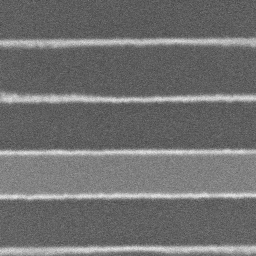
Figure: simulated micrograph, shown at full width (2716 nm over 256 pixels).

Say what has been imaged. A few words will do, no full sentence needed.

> lines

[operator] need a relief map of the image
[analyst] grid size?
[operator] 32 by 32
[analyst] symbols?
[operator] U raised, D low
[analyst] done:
DDDDDDDDDDDDDDDDDDDDDDDDDDDDDDDD
DDDDDDDDDDDDDDDDDDDDDDDDDDDDDDDD
DDDDDDDDDDDDDDDDDDDDDDDDDDDDDDDD
DDDDDDDDDDDDDDDDDDDDDDDDDDDDDDDD
DDDDDDDDDDDDDDDDDDDDDDDDDDDDDDDD
UUUUUUUUUUUUUUUUUUUUUUUUUUUUUUUU
UUUUUUUUUUUUUUUUUUUUUUUUUUUUUUUU
UUUUUUUUUUUUUUUUUUUUUUUUUUUUUUUU
UUUUUUUUUUUUUUUUUUUUUUUUUUUUUUUU
UUUUUUUUUUUUUUUUUUUUUUUUUUUUUUUU
UUUUUUUUUUUUUUUUUUUUUUUUUUUUUUUU
UUUUUUUUUUUUUUUUUUUUUUUUUUUUUUUU
DDDDDDDDDDDDDDUUUUUDDDDDDDDDDDDD
DDDDDDDDDDDDDDDDDDDDDDDDDDDDDDDD
DDDDDDDDDDDDDDDDDDDDDDDDDDDDDDDD
DDDDDDDDDDDDDDDDDDDDDDDDDDDDDDDD
DDDDDDDDDDDDDDDDDDDDDDDDDDDDDDDD
DDDDDDDDDDDDDDDDDDDDDDDDDDDDDDDD
DDDDDDDDDDDDDDDDDDDDDDDDDDDDDDDD
UUUUUUUUUUUUUUUUUUUUUUUUUUUUUUUU
UUUUUUUUUUUUUUUUUUUUUUUUUUUUUUUU
UUUUUUUUUUUUUUUUUUUUUUUUUUUUUUUU
UUUUUUUUUUUUUUUUUUUUUUUUUUUUUUUU
UUUUUUUUUUUUUUUUUUUUUUUUUUUUUUUU
UUUUUUUUUUUUUUUUUUUUUUUUUUUUUUUU
DDDDDDDDDDDDDDDDDDDDDDDDDDDDDDDD
DDDDDDDDDDDDDDDDDDDDDDDDDDDDDDDD
DDDDDDDDDDDDDDDDDDDDDDDDDDDDDDDD
DDDDDDDDDDDDDDDDDDDDDDDDDDDDDDDD
DDDDDDDDDDDDDDDDDDDDDDDDDDDDDDDD
DDDDDDDDDDDDDDDDDDDDDDDDDDDDDDDD
DDDDDDUUUUUUUUUUUUUUUUUUUUUUUUUU